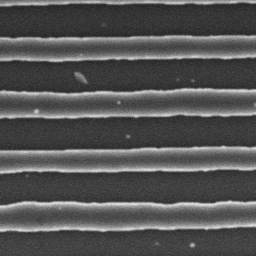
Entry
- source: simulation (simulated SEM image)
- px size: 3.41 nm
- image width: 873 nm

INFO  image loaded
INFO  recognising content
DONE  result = lines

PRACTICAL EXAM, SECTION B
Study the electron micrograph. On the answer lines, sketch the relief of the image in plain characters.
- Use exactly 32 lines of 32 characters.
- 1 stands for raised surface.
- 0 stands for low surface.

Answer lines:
11111100000000000000000000000000
00000000000000000000000000000000
00000000000000000000000000000000
00000000000000000000000000000000
00000000000000000000000000000000
11111111111111111111111111111111
11111111111111111111111111111111
11011111110000000000000000000000
00000000000000000000000000000000
00000000000000000000000000000000
00000000000000000000000000000000
11100000000011000111111111111111
11111111111111111111111111111111
11111111111111111111111111111111
11111111111111000100000000000000
00000000000000000000000000000000
00000000000000000000000000000000
00000000000000000000000000000000
00000000000000000000000011111111
11111111111111111111111111111111
11111111111111111111111111111111
11000000000000000000000000000000
00000000000000000000000000000000
00000000000000000000000000000000
00000000000000000000000000000000
00111111111101111111001110011111
11111111111111111111111111111111
11111111111111111111111111111111
11111111111111111111111111110000
00000000000000000000000000000000
00000000000000000000000000000000
00000000000000000000000000000000